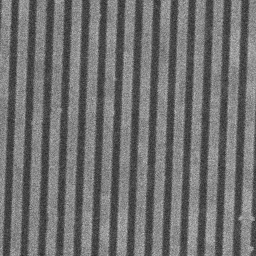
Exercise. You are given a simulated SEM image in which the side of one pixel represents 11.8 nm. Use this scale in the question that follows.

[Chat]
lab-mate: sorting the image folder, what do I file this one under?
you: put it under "parallel lines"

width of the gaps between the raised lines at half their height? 0.102 microns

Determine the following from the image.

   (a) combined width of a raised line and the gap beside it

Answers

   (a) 209 nanometers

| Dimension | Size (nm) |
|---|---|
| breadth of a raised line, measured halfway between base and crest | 108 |